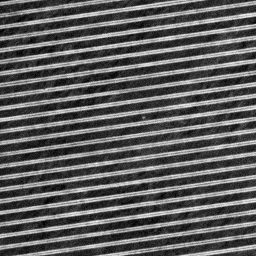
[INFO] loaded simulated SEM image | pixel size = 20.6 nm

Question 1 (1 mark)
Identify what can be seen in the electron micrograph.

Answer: parallel lines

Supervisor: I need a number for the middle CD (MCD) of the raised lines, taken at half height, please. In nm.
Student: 53.7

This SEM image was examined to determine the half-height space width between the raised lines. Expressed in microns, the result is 0.179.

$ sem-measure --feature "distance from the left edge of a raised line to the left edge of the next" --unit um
0.237